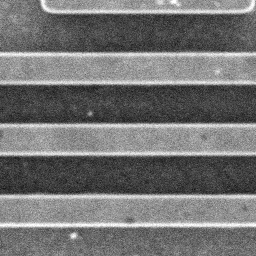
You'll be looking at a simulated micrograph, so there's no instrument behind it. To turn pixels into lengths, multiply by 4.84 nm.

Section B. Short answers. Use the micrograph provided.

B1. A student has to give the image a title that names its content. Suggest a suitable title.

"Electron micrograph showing groups of lines, slits or small figures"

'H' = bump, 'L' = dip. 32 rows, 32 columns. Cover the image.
LLLLLHHHHHHHHHHHHHHHHHHHHHHHHHHH
LLLLLLLHHHHHHHHHHHHHHHHHHHHHHHLL
LLLLLLLLLLLLLLLLLLLLLLLLLLLLLLLL
LLLLLLLLLLLLLLLLLLLLLLLLLLLLLLLL
LLLLLLLLLLLLLLLLLLLLLLLLLLLLLLLL
LLLLLLLLLLLLLLLLLLLLLLLLLLLLLLLL
LLLLLLLLLLLLLLLLLLLLLLLLLLLLLLLL
HHHHHHHHHHHHHHHHHHHHHHHHHHHHHHHH
HHHHHHHHHHHHHHHHHHHHHHHHHHHHHHHH
HHHHHHHHHHHHHHHHHHHHHHHHHHHHHHHH
LLLLLLLLLLLLLLLLLLLLLLLLLLLLLLLL
LLLLLLLLLLLLLLLLLLLLLLLLLLLLLLLL
LLLLLLLLLLLLLLLLLLLLLLLLLLLLLLLL
LLLLLLLLLLLLLLLLLLLLLLLLLLLLLLLL
LLLLLLLLLLLLLLLLLLLLLLLLLLLLLLLL
LLLLLLLLLLLLLLLLLLLLLLLLLLLLLLLL
HHHHHHHHHHHHHHHHHHHHHHHHHHHHHHHH
HHHHHHHHHHHHHHHHHHHHHHHHHHHHHHHH
HHHHHHHHHHHHHHHHHHHHHHHHHHHHHHHH
LLLLLLLLLLLLLLLLLLLLLLLLLLLLLLLL
LLLLLLLLLLLLLLLLLLLLLLLLLLLLLLLL
LLLLLLLLLLLLLLLLLLLLLLLLLLLLLLLL
LLLLLLLLLLLLLLLLLLLLLLLLLLLLLLLL
LLLLLLLLLLLLLLLLLLLLLLLLLLLLLLLL
LLLHHHHHHHHHHHHHHHHHHHHHHHHHHHHH
HHHHHHHHHHHHHHHHHHHHHHHHHHHHHHHH
HHHHHHHHHHHHHHHHHHHHHHHHHHHHHHHH
HHHHHHHHHHHHHHHHHHHHHHHHHHHHHHHH
LLLLLLLLLLLLLLLLLLLLLLLLLLLLLLLL
LLLLLLLLLLLLLLLLLLLLLLLLLLLLLLLL
LLLLLLLLLLLLLLLLLLLLLLLLLLLLLLLL
LLLLLLLLLLLLLLLLLLLLLLLLLLLLLLLL